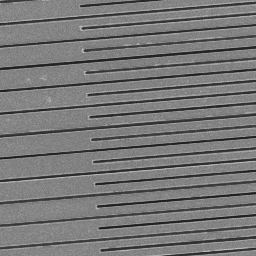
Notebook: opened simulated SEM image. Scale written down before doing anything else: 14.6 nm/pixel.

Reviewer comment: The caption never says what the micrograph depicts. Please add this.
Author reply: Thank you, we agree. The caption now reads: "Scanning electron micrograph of parallel lines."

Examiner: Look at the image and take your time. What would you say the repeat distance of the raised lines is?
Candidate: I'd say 162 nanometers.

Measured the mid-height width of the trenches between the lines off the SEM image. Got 41.7 nanometres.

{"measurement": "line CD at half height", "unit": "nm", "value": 127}